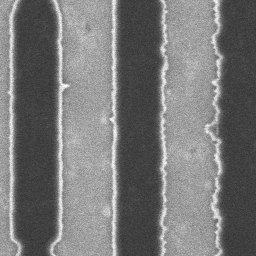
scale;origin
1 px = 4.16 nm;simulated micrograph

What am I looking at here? one or a few lines or trenches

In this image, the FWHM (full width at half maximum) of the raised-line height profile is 212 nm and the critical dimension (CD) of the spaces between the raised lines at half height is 218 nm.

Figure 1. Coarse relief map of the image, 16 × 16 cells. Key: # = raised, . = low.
.###...###...###
.###...###....##
.###...###...###
.###...###....##
.###...###....##
.###...###...###
.###...###...###
.###...###...###
.###...###...###
.###...###....##
.###...###....##
.###...###....##
.###...###...###
.###...###...###
.###...###....##
.##....###....##